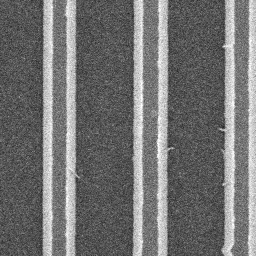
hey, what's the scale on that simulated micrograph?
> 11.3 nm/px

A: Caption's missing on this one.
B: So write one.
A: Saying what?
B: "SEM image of one or a few lines or trenches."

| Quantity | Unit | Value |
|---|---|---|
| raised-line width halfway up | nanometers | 259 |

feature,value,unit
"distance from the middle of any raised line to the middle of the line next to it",91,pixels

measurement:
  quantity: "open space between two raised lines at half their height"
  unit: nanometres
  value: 764